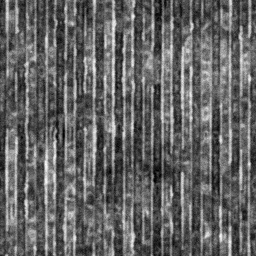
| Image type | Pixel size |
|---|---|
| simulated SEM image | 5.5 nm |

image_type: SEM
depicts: parallel lines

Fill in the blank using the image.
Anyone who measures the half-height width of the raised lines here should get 10.5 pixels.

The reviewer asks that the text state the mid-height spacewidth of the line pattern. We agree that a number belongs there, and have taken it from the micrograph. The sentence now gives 47.5 nanometers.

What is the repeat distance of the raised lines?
107 nanometres